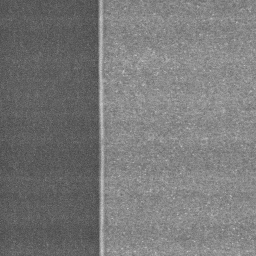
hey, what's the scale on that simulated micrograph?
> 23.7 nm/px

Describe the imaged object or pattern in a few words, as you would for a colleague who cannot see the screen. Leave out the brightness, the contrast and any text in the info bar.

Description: one or a few lines or trenches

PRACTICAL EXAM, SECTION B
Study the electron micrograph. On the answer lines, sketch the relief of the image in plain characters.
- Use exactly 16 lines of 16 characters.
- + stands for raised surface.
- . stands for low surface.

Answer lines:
......++++++++++
......++++++++++
......++++++++++
......++++++++++
......++++++++++
......++++++++++
......++++++++++
......++++++++++
......++++++++++
......++++++++++
......++++++++++
......++++++++++
......++++++++++
......++++++++++
......++++++++++
......++++++++++